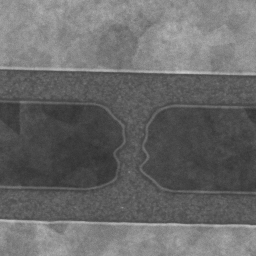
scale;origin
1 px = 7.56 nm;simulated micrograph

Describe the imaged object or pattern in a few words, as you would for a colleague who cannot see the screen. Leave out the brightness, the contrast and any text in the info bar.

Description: one or a few lines or trenches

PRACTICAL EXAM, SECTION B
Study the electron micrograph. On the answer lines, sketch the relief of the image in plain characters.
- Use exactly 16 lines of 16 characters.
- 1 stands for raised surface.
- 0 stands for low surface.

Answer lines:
1111111111111111
1111111111111111
1111111111111111
1111111111111111
0000000000111111
0000000000000000
1111110000000000
1111111001111111
1111111101111111
1111111001111111
1111111001111111
1111111000111111
0000000000000000
0000000000000000
1111111111111111
1111111111111111